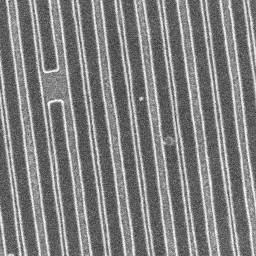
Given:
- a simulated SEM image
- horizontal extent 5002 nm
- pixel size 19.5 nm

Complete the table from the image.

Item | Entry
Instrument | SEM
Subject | parallel lines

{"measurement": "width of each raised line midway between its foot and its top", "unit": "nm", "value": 305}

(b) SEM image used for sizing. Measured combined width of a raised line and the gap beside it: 414 nm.